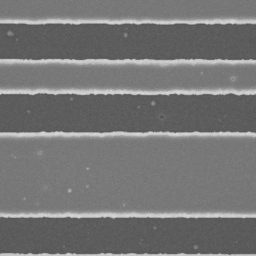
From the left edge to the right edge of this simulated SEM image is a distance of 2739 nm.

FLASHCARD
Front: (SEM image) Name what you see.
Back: lines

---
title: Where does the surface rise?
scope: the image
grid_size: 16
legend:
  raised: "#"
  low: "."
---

################
................
................
................
################
################
................
................
################
################
################
################
################
################
................
................